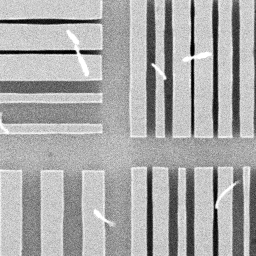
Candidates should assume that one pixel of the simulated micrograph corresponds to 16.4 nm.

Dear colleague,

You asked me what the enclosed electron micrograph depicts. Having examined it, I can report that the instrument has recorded groups of lines, slits or small figures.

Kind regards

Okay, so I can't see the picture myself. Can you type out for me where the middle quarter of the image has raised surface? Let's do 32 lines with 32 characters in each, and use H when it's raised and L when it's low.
HHHHHHHHHLLLLLLLLHHHLLLHHLLHHHHH
HHHHHHHHHLLLLLLLLHHHLLLHHLLHHHHH
HHHHHHHHHLLLLLLLLHHHLLLHHLLHHHHH
HHHHHHHHHLLLLLLLLHHHLLLHHLLHHHHH
LLLLLLLLLLLLLLLLLHHHLLLHHLLHHHHH
LLLLLLLLLLLLLLLLLHHHLLLHHLLHHHHH
LLLLLLLLLLLLLLLLLHHHLLLHHLLHHHHH
HHHHHHHHHLLLLLLLLHHHLLLHHLLHHHHH
HHHHHHHHHLLLLLLLLHHHLLLHHLLHHHHH
HHHHHHHHHLLLLLLLLHHHLLLHHLLHHHHH
LLLLLLLLLLLLLLLLLHHHLLLHHLLHHHHH
LLLLLLLLLLLLLLLLLHHHLLLHHLLHHHHH
LLLLLLLLLLLLLLLLLHHHLLLHHLLHHHHH
LLLLLLLLLLLLLLLLLHHHLLLHHLLHHHHH
LLLLLLLLLLLLLLLLLHHHLLLHHLLHHHHH
HHHHHHHHHLLLLLLLLHHHLLLHHLLHHHHH
HHHHHHHHHLLLLLLLLHHHLLLHHLLHHHHH
LLLLLLLLLLLLLLLLLHHHLLLHHLLHHHHH
LLLLLLLLLLLLLLLLLLLLLLLLLLLLLLLL
LLLLLLLLLLLLLLLLLLLLLLLLLLLLLLLL
LLLLLLLLLLLLLLLLLLLLLLLLLLLLLLLL
LLLLLLLLLLLLLLLLLLLLLLLLLLLLLLLL
LLLLLLLLLLLLLLLLLLLLLLLLLLLLLLLL
LLLLLLLLLLLLLLLLLLLLLLLLLLLLLLLL
LLLLLLLLLLLLLLLLLLLLLLLLLLLLLLLL
LLLLLLLLLLLLLLLLLLLLLLLLLLLLLLLL
LLLLLLLLLLLLLLLLLHHHLLHHHHLLLHLL
LLLLLHHHHHLLLLLLLHHHLLHHHHLLLHLL
LLLLLHHHHHLLLLLLLHHHLLHHHHLLLHLL
LLLLLHHHHHLLLLLLLHHHLLHHHHLLLHLL
LLLLLHHHHHLLLLLLLHHHLLHHHHLLLHLL
LLLLLHHHHHLLLLLLLHHHLLHHHHLLLHLL